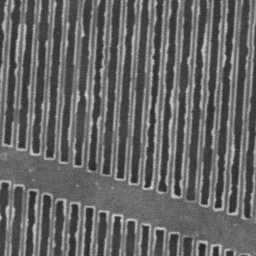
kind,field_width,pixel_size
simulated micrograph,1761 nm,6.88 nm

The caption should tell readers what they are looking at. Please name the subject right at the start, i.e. parallel lines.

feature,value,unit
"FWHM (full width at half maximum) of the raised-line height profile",45.5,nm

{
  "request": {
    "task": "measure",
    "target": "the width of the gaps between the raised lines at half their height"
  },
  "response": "51.5 nm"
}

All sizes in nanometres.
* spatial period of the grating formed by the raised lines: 98.5